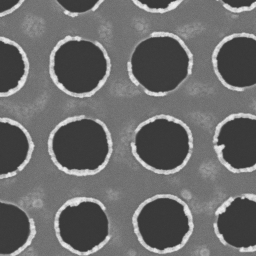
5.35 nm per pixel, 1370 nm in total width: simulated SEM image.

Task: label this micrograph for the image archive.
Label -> holes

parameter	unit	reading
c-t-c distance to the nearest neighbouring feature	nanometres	424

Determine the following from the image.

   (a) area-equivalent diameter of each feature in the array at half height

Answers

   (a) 282 nm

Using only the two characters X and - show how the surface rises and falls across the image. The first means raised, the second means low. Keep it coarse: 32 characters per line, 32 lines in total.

--XXXXXX----XXXXXX---XXXXXXX----
XXXXXXXXX-XXXXXXXXXXXXXXXXXXXXXX
XXXXXXXXXXXXXXXXXXXXXXXXXXXXXXXX
XXXXXXXXXXXXXXXXXXXXXXXXXXXXXXXX
XXXXXXXXXXXXXXXXXXXXXXXXXXXXXXXX
-XXXXXXX----XXXXX-----XXXXXX----
--XXXXX------XXXX------XXXX-----
---XXXX------XXX--------XXX-----
---XXXX------XXX--------XXX-----
---XXXX------XXXX------XXXXX----
--XXXXXX----XXXXXX----XXXXXXX---
XXXXXXXXX--XXXXXXXX--XXXXXXXXXXX
XXXXXXXXXXXXXXXXXXXXXXXXXXXXXXXX
XXXXXXXXXXXXXXXXXXXXXXXXXXXXXXXX
XXXXXXXXXXXXXXXXXXXXXXXXXXXXXXXX
-XXXXXXX----XXXXXX----XXXXXX----
---XXXX------XXXX------XXXX-----
---XXXX------XXXX-------XXX-----
----XXX------XXXX-------XXXX----
---XXXX------XXXX------XXXXX----
---XXXXX-----XXXXX-----XXXXXX---
-XXXXXXXXXXXXXXXXXXXXXXXXXXXXXXX
XXXXXXXXXXXXXXXXXXXXXXXXXXXXXXXX
XXXXXXXXXXXXXXXXXXXXXXXXXXXXXXXX
XXXXXXXXXXXXXXXXXXXXXXXXXXXXXXXX
-XXXXXXXXX--XXXXXX-----XXXXXX---
---XXXXX-----XXXXX-----XXXXX----
----XXX------XXXX------XXXX-----
----XXX-------XXX-------XXX-----
----XXXX-----XXXXX-----XXXXX----
---XXXXX----XXXXXX----XXXXXXX---
--XXXXXXXXXXXXXXXXXXXXXXXXXXXXXX